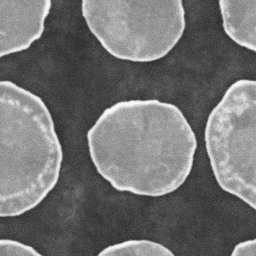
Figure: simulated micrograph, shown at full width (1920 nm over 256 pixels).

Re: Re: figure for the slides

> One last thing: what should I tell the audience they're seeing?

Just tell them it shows raised bodies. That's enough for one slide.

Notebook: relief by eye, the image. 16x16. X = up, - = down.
XXX--XXXXXX---XX
XXX--XXXXXX---XX
XX----XXXXX----X
-------XXX------
----------------
X-------------XX
XXX-----XX----XX
XXX---XXXXXX-XXX
XXX---XXXXXX-XXX
XXXX--XXXXXX-XXX
XXXX--XXXXXX-XXX
XXX----XXXX---XX
XXX------------X
----------------
----------------
XX-----XXX-----X